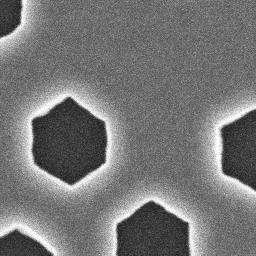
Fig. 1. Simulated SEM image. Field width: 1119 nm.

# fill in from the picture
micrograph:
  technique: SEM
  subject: holes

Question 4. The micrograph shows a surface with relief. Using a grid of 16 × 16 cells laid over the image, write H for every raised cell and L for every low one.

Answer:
LHHHHHHHHHHHHHHH
LHHHHHHHHHHHHHHH
HHHHHHHHHHHHHHHH
HHHHHHHHHHHHHHHH
HHHHHHHHHHHHHHHH
HHHHHHHHHHHHHHHH
HHHHLHHHHHHHHHHH
HHLLLLHHHHHHHHHL
HHLLLLLHHHHHHHLL
HHLLLLLHHHHHHHLL
HHLLLLHHHHHHHHLL
HHHHLHHHHHHHHHHL
HHHHHHHHHHHHHHHH
HHHHHHHHLLLHHHHH
LLHHHHHLLLLLHHHH
LLLHHHHLLLLLHHHH